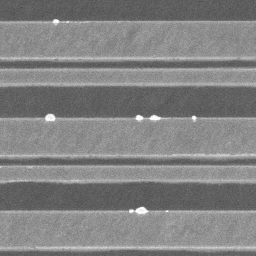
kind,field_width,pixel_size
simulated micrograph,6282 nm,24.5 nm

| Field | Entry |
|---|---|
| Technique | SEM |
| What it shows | lines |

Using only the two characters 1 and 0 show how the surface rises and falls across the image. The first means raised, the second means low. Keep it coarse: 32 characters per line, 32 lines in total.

00000000000000000000000000000000
00000000000000000000000000000000
00000000000000000000000000000000
11111111111111111111111111111111
11111111111111111111111111111111
11111111111111111111111111111111
11111111111111111111111111111111
11111111111111111111111111111111
11111111111111111111111111111111
11111111111111111111111111111111
00000000000000000000000000000000
00000000000000000000000000000000
00000000000000000000000000000000
00000000000000000000000000000000
00000010000000000000000000000000
11111111111111111111111111111111
11111111111111111111111111111111
11111111111111111111111111111111
11111111111111111111111111111111
11111111111111111111111111111111
11111111111111111111111111111111
11111111111111111111111111111111
11111111111111111111111111111111
00000000000000000000000000000000
00000000000000000000000000000000
00000000000000000000000000000000
00000000000000001110111111110111
11111111111111111111111111111111
11111111111111111111111111111111
11111111111111111111111111111111
11111111111111111111111111111111
11111111111111111111111111111111